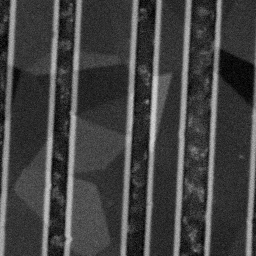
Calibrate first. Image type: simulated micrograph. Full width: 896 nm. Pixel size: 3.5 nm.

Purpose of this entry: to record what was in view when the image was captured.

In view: one or a few lines or trenches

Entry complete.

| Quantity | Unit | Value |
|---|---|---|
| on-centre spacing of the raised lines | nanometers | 241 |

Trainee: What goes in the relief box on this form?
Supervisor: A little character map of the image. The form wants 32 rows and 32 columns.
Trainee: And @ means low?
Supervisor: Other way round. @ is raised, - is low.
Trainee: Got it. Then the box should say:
--@@@@@---@@@@@@@---@@@----@@@@@
--@@@@@---@@@@@@@---@@@----@@@@@
--@@@@@---@@@@@@@---@@@----@@@@@
--@@@@@---@@@@@@@---@@@----@@@@@
-@@@@@@---@@@@@@@---@@@----@@@@@
-@@@@@@---@@@@@@@---@@@----@@@@@
-@@@@@@---@@@@@@@---@@@----@@@@@
-@@@@@@--@@@@@@@@---@@@----@@@@@
-@@@@@@--@@@@@@@---@@@@----@@@@@
-@@@@@@--@@@@@@@----@@@----@@@@@
-@@@@@---@@@@@@@---@@@@----@@@@@
-@@@@@---@@@@@@@---@@@@----@@@@@
-@@@@@---@@@@@@@---@@@@----@@@@@
-@@@@@---@@@@@@@---@@@@----@@@@@
-@@@@@---@@@@@@@---@@@@----@@@@@
-@@@@@---@@@@@@@---@@@@----@@@@@
-@@@@@---@@@@@@@---@@@@----@@@@@
-@@@@@---@@@@@@@---@@@@----@@@@@
-@@@@@---@@@@@@@---@@@@----@@@@@
-@@@@@---@@@@@@@---@@@@---@@@@@@
-@@@@@---@@@@@@@---@@@@---@@@@@@
-@@@@@---@@@@@@@---@@@----@@@@@-
-@@@@@---@@@@@@@---@@@----@@@@@-
-@@@@@---@@@@@@@---@@@----@@@@@-
@@@@@@---@@@@@@@---@@@----@@@@@-
@@@@@@---@@@@@@@---@@@----@@@@@-
@@@@@@---@@@@@@@---@@@----@@@@@-
@@@@@@---@@@@@@@---@@@----@@@@@-
@@@@@@---@@@@@@----@@@----@@@@@-
@@@@@@---@@@@@@----@@@----@@@@@-
@@@@@@--@@@@@@@---@@@@----@@@@@-
@@@@@@--@@@@@@@---@@@@----@@@@@-